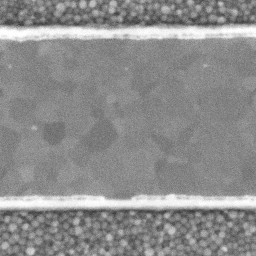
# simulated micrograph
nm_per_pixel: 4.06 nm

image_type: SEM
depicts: one or a few lines or trenches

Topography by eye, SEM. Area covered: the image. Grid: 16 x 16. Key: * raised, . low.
................
................
****************
****************
****************
****************
****************
****************
****************
****************
****************
****************
****************
................
................
................